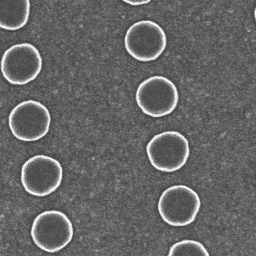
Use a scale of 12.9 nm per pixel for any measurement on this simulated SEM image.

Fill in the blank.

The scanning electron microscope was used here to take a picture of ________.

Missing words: a regular array of raised bodies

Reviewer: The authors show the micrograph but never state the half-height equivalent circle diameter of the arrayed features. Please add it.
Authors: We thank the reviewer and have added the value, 506 nm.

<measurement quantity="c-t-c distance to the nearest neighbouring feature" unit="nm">716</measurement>